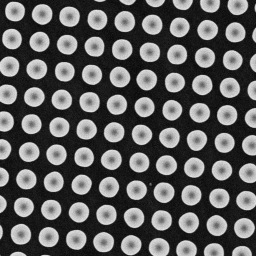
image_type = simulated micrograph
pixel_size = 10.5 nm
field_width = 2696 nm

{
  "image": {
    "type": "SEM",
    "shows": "an array of small figures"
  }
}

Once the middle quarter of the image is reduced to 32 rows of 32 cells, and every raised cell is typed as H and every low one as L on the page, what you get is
HHLLLLHHLLLLLLLLLLLLLLLLLLLLLLLL
HHHLLHHHHLLLHHHHLLLLHLLLLLLLLLLL
HHHLLHHHHLLHHHHHLLLHHHHLLLHHHLLL
HHLLLHHHHLLHHHHHLLHHHHHLLHHHHHLL
LLLLLHHHHLLLHHHHLLHHHHHLLHHHHHLL
LLLLLLLLLLLLLHHLLLLHHHHLLHHHHHLL
LLLLLLLLLLLLLLLLLLLLHLLLLLHHHLLL
HLLLLHHHLLLLLLLLLLLLLLLLLLLLLLLL
HHLLHHHHHLLHHHHLLLLHHLLLLLLLLLLL
HHLLHHHHHLLHHHHHLLHHHHLLLLHHLLLL
HHLLHHHHHLLHHHHHLLHHHHHLLHHHHLLL
LLLLLHHHLLLHHHHLLLHHHHHLLHHHHLLL
LLLLLLLLLLLLHHLLLLHHHHLLLHHHHLLH
LLLLLLLLLLLLLLLLLLLLLLLLLLHHLLLL
HLLLHHHLLLLLLLLLLLLLLLLLLLLLLLLL
HLLHHHHHLLLHHHHLLLHHLLLLLLLLLLLL
HLLHHHHHLLHHHHHLLHHHHHLLLHHHLLLL
HLLHHHHHLLHHHHHLLHHHHHLLHHHHHLLH
LLLLHHHLLLHHHHHLLHHHHHLLHHHHHLLH
LLLLLLLLLLLLHLLLLLHHHLLLHHHHHLLH
LLLLLLLLLLLLLLLLLLLLLLLLLHHHLLLH
LLLHHHHLLLLLLLLLLLLLLLLLLLLLLLLL
HLLHHHHLLLHHHHLLLHHHLLLLLLLLLLLL
HLLHHHHLLHHHHHLLLHHHHLLLHHHLLLLL
LLLHHHHLLHHHHHLLLHHHHLLHHHHHLLLH
LLLLHHLLLLHHHHLLHHHHHLLHHHHHLLHH
LLLLLLLLLLLLLLLLLHHHHLLHHHHHLLHH
LLLLLLLLLLLLLLLLLLLLLLLLLHHLLLLH
LLLHHHLLLLHHLLLLLLLLLLLLLLLLLLLL
LLHHHHHLLHHHHLLLLHHHLLLLLLLLLLLL
LLHHHHHLLHHHHHLLHHHHLLLHHHHLLLLH
LLHHHHLLLHHHHHLLHHHHHLHHHHHHLLHH